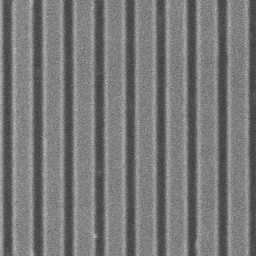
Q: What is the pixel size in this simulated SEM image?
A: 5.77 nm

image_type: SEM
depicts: parallel lines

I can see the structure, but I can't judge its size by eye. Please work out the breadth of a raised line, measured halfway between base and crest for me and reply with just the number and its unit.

20 px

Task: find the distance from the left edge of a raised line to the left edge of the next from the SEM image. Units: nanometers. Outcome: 178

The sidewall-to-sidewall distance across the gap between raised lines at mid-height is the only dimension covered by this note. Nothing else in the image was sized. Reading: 60.5 nm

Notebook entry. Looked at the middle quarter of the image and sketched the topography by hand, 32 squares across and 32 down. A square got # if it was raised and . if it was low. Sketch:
...####...#####...#####...####..
...####...#####...#####...#####.
...####...#####...#####...#####.
...####...#####...#####...#####.
...####...#####...#####...#####.
...####...#####...#####...#####.
...####...#####...#####...#####.
...####...#####...#####...#####.
...####...#####...#####...#####.
...####...#####...#####...#####.
...####...#####...#####...#####.
...####...#####...#####...#####.
...####...#####...#####...#####.
...####...#####...#####...#####.
...####...#####...#####...#####.
...####...#####...#####...#####.
...####...#####...#####...#####.
...####...#####...#####...#####.
...####...#####...#####...#####.
...####...#####...#####...#####.
...####...#####...#####...#####.
...####...#####...#####...#####.
...####...#####...#####...#####.
...####....####...#####...#####.
...####....####...#####...#####.
...####....####...#####...#####.
...####....####...#####...#####.
...####....####...#####...#####.
...####....####...#####...#####.
...####....####...#####...#####.
...####....####...#####...#####.
...####...#####...#####...#####.